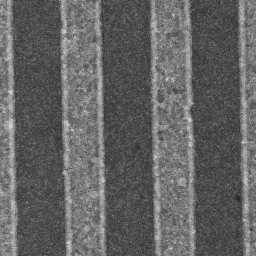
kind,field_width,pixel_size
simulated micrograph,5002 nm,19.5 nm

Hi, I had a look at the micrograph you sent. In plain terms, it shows one or a few lines or trenches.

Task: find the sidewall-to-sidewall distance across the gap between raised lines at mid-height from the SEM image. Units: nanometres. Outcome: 1090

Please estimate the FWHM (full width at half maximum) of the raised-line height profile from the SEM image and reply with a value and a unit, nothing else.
662 nm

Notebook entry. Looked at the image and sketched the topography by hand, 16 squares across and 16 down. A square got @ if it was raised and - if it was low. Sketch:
@---@@----@@---@
@---@@----@@---@
@---@@----@@---@
@---@@----@@---@
@---@@----@@---@
@---@@----@@---@
@---@@----@@---@
@---@@----@@---@
@---@@----@@---@
@---@@----@@---@
@---@@----@@---@
@---@@----@@---@
@---@@----@@---@
@---@@----@@---@
@---@@----@@---@
@---@@----@@---@